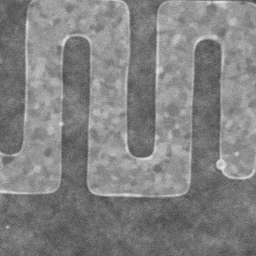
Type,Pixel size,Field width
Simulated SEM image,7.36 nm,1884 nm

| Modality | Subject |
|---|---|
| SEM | groups of lines, slits or small figures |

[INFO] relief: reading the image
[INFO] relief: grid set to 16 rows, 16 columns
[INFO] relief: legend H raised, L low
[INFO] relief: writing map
LLHHHHHHLLHHHHHH
LLHHHHHHLLHHHHHH
LLHHLHHHLLHHHLHH
LLHHLLHHLLHHLLHH
LLHHLLHHLLHHLLHH
LLHHLLHHLLHHLLHH
LLHHLLHHLLHHLLHH
LLHHLLHHLLHHLLHH
LHHHLLHHLLHHLLHH
LHHHLLHHLLHHLLHH
HHHHLLHHHHHHLLHH
HHHHLLHHHHHHLLLL
LLLLLLLLLLLLLLLL
LLLLLLLLLLLLLLLL
LLLLLLLLLLLLLLLL
LLLLLLLLLLLLLLLL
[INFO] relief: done